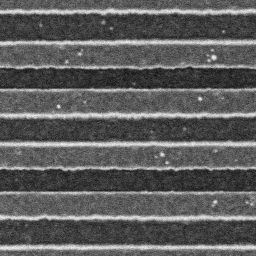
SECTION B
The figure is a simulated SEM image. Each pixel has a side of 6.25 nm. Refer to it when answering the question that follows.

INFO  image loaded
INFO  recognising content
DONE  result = lines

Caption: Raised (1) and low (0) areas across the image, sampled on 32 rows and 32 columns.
11111111111111111111111111111111
01010101100010010001000011110100
00000000000000000000000000000000
00000000000000000000000000000000
00000000000000000000000000000000
11111111111111111111111111111111
11111111111111111111111111111111
11111111111111111111111111111111
00101001001111101110110000000001
00000000000000000000000000000000
00000000000000000000000000000000
11111111111111111111111111111111
11111111111111111111111111111111
11111111111111111111111111111111
00000000000000010000000000000000
00000000000000000000000000000000
00000000000000000000000000000000
00000000000000000000000000000000
11111111111111111111111111111111
11111111111111111111111111111111
11111111111111111111111111111111
00000000000000000000000000000000
00000000000000000000000000000000
00000000000000000000000000000000
11111111111111111111111111111111
11111111111111111111111111111111
11111111111111111111111111111111
00000000000000000000000000000000
00000000000000000000000000000000
00000000000000000000000000000000
00000000000000000000000000000000
11111111111111111111111111111111